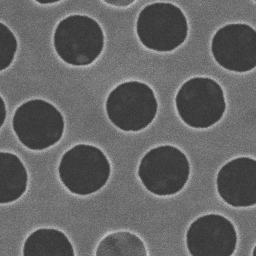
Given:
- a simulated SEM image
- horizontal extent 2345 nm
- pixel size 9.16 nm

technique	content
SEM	holes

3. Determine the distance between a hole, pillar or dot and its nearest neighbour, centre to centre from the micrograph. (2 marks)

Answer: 632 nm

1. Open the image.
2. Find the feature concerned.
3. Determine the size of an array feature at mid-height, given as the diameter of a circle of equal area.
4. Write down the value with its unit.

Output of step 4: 464 nm